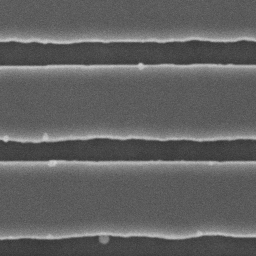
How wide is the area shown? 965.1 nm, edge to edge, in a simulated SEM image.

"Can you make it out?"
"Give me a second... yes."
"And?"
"lines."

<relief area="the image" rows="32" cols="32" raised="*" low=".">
********************************
********************************
********************************
********************************
********************************
................................
................................
................................
********************************
********************************
********************************
********************************
********************************
********************************
********************************
********************************
********************************
********...........**...***.....
................................
................................
********************************
********************************
********************************
********************************
********************************
********************************
********************************
********************************
********************************
**********.....*..*******....***
................................
................................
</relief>